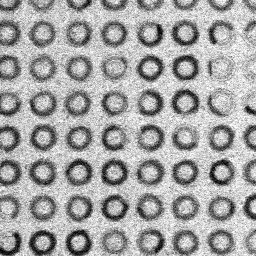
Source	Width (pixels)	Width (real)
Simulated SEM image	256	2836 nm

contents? a regular array of ring-shaped raised bodies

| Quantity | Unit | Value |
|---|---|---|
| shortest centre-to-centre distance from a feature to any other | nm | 382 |